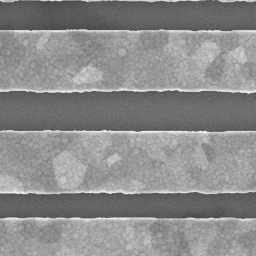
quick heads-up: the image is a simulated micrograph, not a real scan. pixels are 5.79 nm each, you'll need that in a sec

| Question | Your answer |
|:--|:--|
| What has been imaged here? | lines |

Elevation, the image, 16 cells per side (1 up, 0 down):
0000000000000000
0000000000000000
1111111111111111
1111111111111111
1111111111111111
1111111111111111
0000000000000000
0000000000000000
1111111111111111
1111111111111111
1111111111111111
1111111111111111
0000000000000000
0000000000000000
1111111111111111
1111111111111111